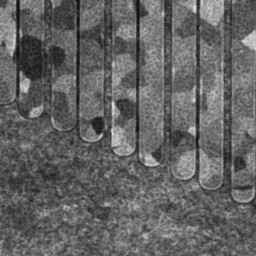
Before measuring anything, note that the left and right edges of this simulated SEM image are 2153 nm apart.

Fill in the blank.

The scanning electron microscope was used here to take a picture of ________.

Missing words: parallel lines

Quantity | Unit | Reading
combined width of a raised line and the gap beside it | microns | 0.253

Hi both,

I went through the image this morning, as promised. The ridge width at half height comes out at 200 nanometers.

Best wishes